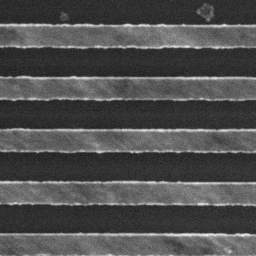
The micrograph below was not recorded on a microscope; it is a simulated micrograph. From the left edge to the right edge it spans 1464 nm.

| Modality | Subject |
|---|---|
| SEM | lines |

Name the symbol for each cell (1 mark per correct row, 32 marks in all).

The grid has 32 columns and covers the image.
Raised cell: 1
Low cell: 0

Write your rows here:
00000000000000000000000000000000
00000000000000000000000000000000
00000000000000000000000000000000
11111111111111111111111111111111
11111111111111111111111111111111
11111111111111111111111111111111
00000000000000000000000000000000
00000000000000000000000000000000
00000000000000000000000000000000
00000000000000000000000000000000
11111111111111111111111111111111
11111111111111111111111111111111
01000100000011000000001100111110
00000000000000000000000000000000
00000000000000000000000000000000
00000000000000000000000000000000
11111111111111111111111111111111
11111111111111111111111111111111
11111111111111111111111111111111
00000000000000000000000000000000
00000000000000000000000000000000
00000000000000000000000000000000
00000000000000000000000000000000
11111111111111111111111111111111
11111111111111111111111111111111
01100011111111111111111111111111
00000000000000000000000000000000
00000000000000000000000000000000
00000000000000000000000000000000
11111111111111111111111111111111
11111111111111111111111111111111
11111111111111111111111111111111